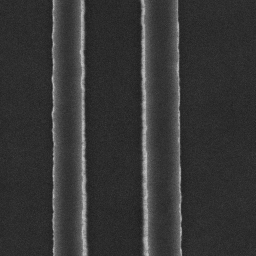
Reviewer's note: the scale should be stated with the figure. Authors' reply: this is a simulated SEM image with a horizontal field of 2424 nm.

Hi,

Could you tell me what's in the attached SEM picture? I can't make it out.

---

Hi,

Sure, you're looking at lines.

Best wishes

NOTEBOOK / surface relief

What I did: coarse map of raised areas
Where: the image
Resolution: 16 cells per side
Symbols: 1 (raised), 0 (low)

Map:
0001100001100000
0001100001100000
0001100001100000
0001100001100000
0001100001100000
0001100001100000
0001100001100000
0001100001100000
0001100001100000
0001100001100000
0001100001100000
0001100001100000
0001100001100000
0001100001100000
0001100001100000
0001100001100000